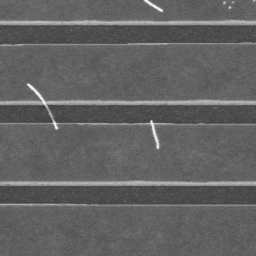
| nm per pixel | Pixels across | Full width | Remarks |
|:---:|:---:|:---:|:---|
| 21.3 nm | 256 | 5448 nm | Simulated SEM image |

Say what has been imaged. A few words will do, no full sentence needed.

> lines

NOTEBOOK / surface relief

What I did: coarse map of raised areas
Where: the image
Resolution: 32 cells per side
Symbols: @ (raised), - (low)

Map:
@@@@@@@@@@@@@@@@@@@@@@@@@@@@@@@@
@@@@@@@@@@@@@@@@@@@@@@@@@@@@@@@@
@@@@@@@@@@@@@@@@@@@@@@@@@@@@@@@@
--------------------------------
--------------------------------
-----------------@@@@@@@@@@@@@@@
@@@@@@@@@@@@@@@@@@@@@@@@@@@@@@@@
@@@@@@@@@@@@@@@@@@@@@@@@@@@@@@@@
@@@@@@@@@@@@@@@@@@@@@@@@@@@@@@@@
@@@@@@@@@@@@@@@@@@@@@@@@@@@@@@@@
@@@@@@@@@@@@@@@@@@@@@@@@@@@@@@@@
@@@@@@@@@@@@@@@@@@@@@@@@@@@@@@@@
@@@@@@@@@@@@@@@@@@@@@@@@@@@@@@@@
--------------------------------
--------------------------------
@@@@@@@@@@@@@@@@-@@@@-----------
@@@@@@@@@@@@@@@@@@@@@@@@@@@@@@@@
@@@@@@@@@@@@@@@@@@@@@@@@@@@@@@@@
@@@@@@@@@@@@@@@@@@@@@@@@@@@@@@@@
@@@@@@@@@@@@@@@@@@@@@@@@@@@@@@@@
@@@@@@@@@@@@@@@@@@@@@@@@@@@@@@@@
@@@@@@@@@@@@@@@@@@@@@@@@@@@@@@@@
@@@@@@@@@@@@@@@@@@@@@@@@@@@@@@@@
--------------------------------
--------------------------------
--------------------------------
@@@@@@@@@@@@@@@@@@@@@@@@@@@@@@@@
@@@@@@@@@@@@@@@@@@@@@@@@@@@@@@@@
@@@@@@@@@@@@@@@@@@@@@@@@@@@@@@@@
@@@@@@@@@@@@@@@@@@@@@@@@@@@@@@@@
@@@@@@@@@@@@@@@@@@@@@@@@@@@@@@@@
@@@@@@@@@@@@@@@@@@@@@@@@@@@@@@@@